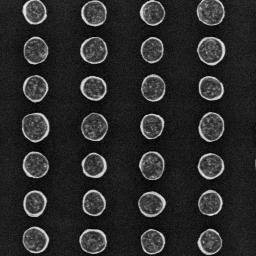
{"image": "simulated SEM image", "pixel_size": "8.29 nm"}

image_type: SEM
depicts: a regular array of raised bodies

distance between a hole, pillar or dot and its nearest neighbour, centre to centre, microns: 0.313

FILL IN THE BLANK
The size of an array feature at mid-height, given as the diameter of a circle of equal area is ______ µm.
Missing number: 0.203